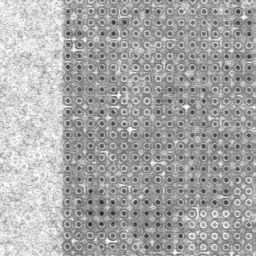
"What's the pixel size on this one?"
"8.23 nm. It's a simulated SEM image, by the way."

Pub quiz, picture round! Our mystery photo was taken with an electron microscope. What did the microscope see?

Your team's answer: a regular array of raised bodies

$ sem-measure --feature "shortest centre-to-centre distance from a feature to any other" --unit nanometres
88.8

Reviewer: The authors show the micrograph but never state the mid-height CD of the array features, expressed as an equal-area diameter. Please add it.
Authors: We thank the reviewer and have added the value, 50 nanometres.